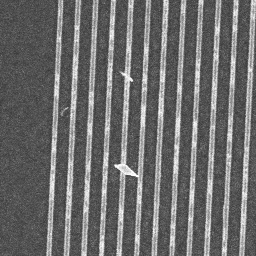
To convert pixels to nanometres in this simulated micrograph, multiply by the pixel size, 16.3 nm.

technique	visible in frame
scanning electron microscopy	parallel lines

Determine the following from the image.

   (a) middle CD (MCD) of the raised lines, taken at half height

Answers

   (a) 63.3 nm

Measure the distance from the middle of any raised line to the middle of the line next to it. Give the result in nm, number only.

286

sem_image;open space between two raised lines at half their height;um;0.233